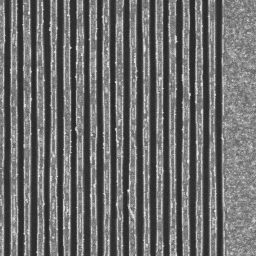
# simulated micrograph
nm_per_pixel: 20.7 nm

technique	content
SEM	parallel lines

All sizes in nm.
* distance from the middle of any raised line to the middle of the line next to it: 274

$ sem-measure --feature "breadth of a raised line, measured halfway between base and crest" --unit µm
0.145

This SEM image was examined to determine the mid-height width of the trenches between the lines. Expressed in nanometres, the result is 127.